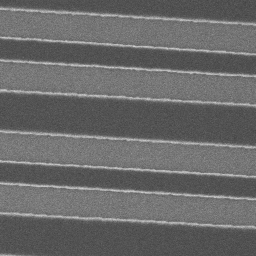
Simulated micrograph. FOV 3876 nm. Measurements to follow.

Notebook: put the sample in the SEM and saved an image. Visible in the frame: lines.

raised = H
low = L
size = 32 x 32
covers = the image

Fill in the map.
HHHHHHHHHHHHHHHHHHHHHHHHHHHHHHHH
LLLLLLLLHHHHHHHHHHHHHHHHHHHHHHHH
LLLLLLLLLLLLLLLLLLLLLLHHHHHHHHHH
LLLLLLLLLLLLLLLLLLLLLLLLLLLLLLLL
LLLLLLLLLLLLLLLLLLLLLLLLLLLLLLLL
HHHHHHHHHHHHHHLLLLLLLLLLLLLLLLLL
HHHHHHHHHHHHHHHHHHHHHHHHHHHHLLLL
HHHHHHHHHHHHHHHHHHHHHHHHHHHHHHHH
LLLLLLLLLLLLLLLHHHHHHHHHHHHHHHHH
LLLLLLLLLLLLLLLLLLLLLLLLLLLLLLLH
LLLLLLLLLLLLLLLLLLLLLLLLLLLLLLLL
HHHHHLLLLLLLLLLLLLLLLLLLLLLLLLLL
HHHHHHHHHHHHHHHHHHHHLLLLLLLLLLLL
HHHHHHHHHHHHHHHHHHHHHHHHHHHHHHHH
HHHHHHHHHHHHHHHHHHHHHHHHHHHHHHHH
HHHHHHHHHHHHHHHHHHHHHHHHHHHHHHHH
LHHHHHHHHHHHHHHHHHHHHHHHHHHHHHHH
LLLLLLLLLLLLLLLLLHHHHHHHHHHHHHHH
LLLLLLLLLLLLLLLLLLLLLLLLLLLLLLLL
LLLLLLLLLLLLLLLLLLLLLLLLLLLLLLLL
HHHHHHLLLLLLLLLLLLLLLLLLLLLLLLLL
HHHHHHHHHHHHHHHHHHHHHHHHLLLLLLLL
HHHHHHHHHHHHHHHHHHHHHHHHHHHHHHHH
LLLLLLLLLHHHHHHHHHHHHHHHHHHHHHHH
LLLLLLLLLLLLLLLLLLLLLLLLLHHHHHHH
LLLLLLLLLLLLLLLLLLLLLLLLLLLLLLLL
LLLLLLLLLLLLLLLLLLLLLLLLLLLLLLLL
HHHHHHHHHHHHHHHHHLLLLLLLLLLLLLLL
HHHHHHHHHHHHHHHHHHHHHHHHHHHHHHHH
HHHHHHHHHHHHHHHHHHHHHHHHHHHHHHHH
HHHHHHHHHHHHHHHHHHHHHHHHHHHHHHHH
HHHHHHHHHHHHHHHHHHHHHHHHHHHHHHHH